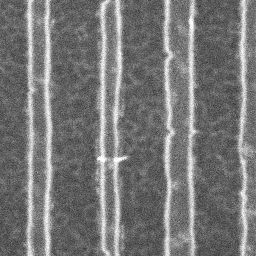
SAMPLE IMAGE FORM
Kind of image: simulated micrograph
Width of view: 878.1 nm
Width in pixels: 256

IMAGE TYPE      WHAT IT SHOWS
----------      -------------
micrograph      one or a few lines or trenches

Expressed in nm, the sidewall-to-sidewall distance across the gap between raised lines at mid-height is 179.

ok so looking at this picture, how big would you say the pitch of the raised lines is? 70.2 px